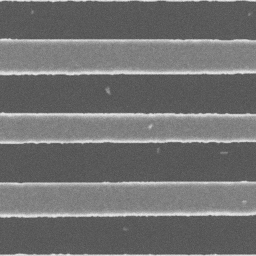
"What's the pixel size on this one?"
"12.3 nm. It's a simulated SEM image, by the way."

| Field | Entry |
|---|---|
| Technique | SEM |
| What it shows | lines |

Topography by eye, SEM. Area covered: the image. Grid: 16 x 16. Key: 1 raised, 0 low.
0000000000000000
0000000000000000
1000000000000000
1111111111111111
1111111111111111
0000000000000000
0000000000000000
1111111111111111
1111111111111111
0000000000000000
0000000000000000
1111111111111111
1111111111111111
1111111100000000
0000000000000000
0000000000000000